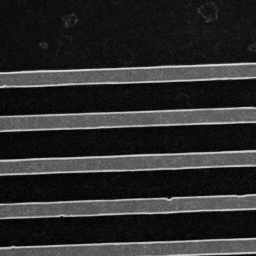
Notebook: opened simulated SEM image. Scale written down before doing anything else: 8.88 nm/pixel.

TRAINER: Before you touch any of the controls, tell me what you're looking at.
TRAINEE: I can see parallel lines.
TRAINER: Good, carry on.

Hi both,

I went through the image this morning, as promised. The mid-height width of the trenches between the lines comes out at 263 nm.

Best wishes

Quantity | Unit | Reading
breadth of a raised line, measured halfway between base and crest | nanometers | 131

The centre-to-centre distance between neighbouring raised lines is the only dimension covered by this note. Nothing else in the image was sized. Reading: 389 nm